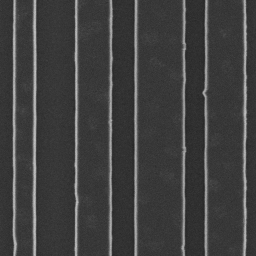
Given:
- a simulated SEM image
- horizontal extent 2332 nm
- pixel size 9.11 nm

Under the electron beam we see one or a few lines or trenches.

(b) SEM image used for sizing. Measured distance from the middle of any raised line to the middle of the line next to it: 67 pixels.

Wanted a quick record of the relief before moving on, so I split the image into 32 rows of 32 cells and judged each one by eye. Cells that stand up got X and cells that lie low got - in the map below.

--XX------XXXX---XXXXXX---XXXXX-
--XX------XXXX---XXXXXX---XXXXX-
--XX------XXXX---XXXXXX---XXXXX-
--XX------XXXX---XXXXXX---XXXXX-
--XX------XXXX---XXXXXX---XXXXX-
--XX------XXXX---XXXXXX---XXXXX-
--XX------XXXX---XXXXXX---XXXXX-
--XX------XXXX---XXXXXX---XXXXX-
--XX------XXXX---XXXXXX---XXXXX-
--XX------XXXX---XXXXXX---XXXXX-
--XX------XXXX---XXXXXX---XXXXX-
--XX------XXXX---XXXXXX---XXXXX-
--XX------XXXX---XXXXXX---XXXXX-
--XX------XXXX---XXXXXX---XXXXX-
--XX------XXXX---XXXXXX---XXXXX-
--XX------XXXX---XXXXXX---XXXXX-
--XX------XXXX---XXXXXX---XXXXX-
--XX------XXXX---XXXXXX---XXXXX-
--XX------XXXX---XXXXXX---XXXXX-
--XX------XXXX---XXXXXX---XXXXX-
--XX------XXXX---XXXXXX---XXXXX-
--XX------XXXX---XXXXXX---XXXXX-
--XX------XXXX---XXXXXX---XXXXX-
--XX------XXXX---XXXXXX---XXXXX-
--XX------XXXX---XXXXXX---XXXXX-
--XX------XXXX---XXXXXX---XXXXX-
--XX------XXXX---XXXXXX---XXXXX-
--XX------XXXX---XXXXXX---XXXXX-
--XX------XXXX---XXXXXX---XXXXX-
--XX------XXXX---XXXXXX---XXXXX-
--XX------XXXX---XXXXXX---XXXXX-
--XX------XXXX---XXXXXX---XXXXX-